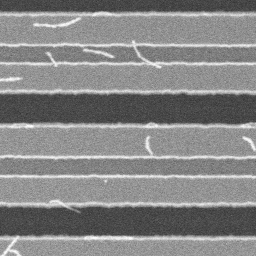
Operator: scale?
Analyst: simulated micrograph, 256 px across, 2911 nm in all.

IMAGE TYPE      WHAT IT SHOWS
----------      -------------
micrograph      lines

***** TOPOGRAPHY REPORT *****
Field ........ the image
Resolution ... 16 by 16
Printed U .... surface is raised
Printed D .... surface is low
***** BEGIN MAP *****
DDDDDDDDDDDDDDDD
UUUUUUUUUUUUUUUU
UUUUUUUUUUUUUUUU
UUUUUUUUUUUUUUUU
UUUUUUUUUUUUUUUU
UUUUUUUUUUUUUUUU
DDDDDDDDDDDDDDDD
DDDDDDDDDDDDDDDD
UUUUUUUUUUUUUUUU
UUUUUUUUUUUUUUUU
UUUUUUUUUUUUUUUU
UUUUUUUUUUUUUUUU
UUUUUUUUUUUUUUUU
DDDDDDDDDDDDDDDD
DDDDDDDDDDDDDDDD
UUUUUUUUUUUUUUUU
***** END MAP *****